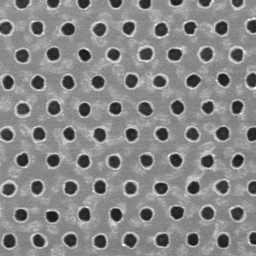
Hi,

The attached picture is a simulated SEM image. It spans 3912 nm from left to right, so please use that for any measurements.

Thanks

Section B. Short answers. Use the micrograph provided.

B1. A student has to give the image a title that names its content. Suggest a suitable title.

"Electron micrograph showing a regular array of holes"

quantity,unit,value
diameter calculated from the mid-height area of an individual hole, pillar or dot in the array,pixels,13.5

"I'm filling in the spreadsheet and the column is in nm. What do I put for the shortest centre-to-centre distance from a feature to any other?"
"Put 445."